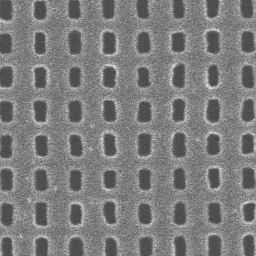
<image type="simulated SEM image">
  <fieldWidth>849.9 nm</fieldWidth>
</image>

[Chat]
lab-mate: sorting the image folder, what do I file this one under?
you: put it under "a regular array of holes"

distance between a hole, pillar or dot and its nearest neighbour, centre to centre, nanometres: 112